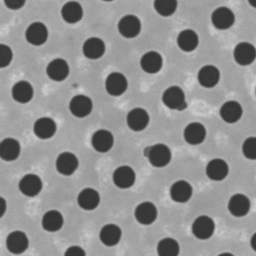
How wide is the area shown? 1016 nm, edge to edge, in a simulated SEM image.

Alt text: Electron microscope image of a regular array of holes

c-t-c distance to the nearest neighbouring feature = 165 nm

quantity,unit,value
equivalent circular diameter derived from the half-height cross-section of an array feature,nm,87.2